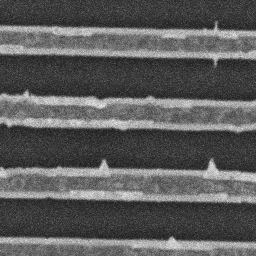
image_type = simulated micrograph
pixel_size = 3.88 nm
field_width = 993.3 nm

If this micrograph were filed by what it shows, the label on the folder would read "one or a few lines or trenches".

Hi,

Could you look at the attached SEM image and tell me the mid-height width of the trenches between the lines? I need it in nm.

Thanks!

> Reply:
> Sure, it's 174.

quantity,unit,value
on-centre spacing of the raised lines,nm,275